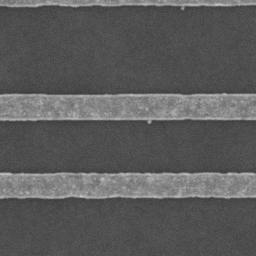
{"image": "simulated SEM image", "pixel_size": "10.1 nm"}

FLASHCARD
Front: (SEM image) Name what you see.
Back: lines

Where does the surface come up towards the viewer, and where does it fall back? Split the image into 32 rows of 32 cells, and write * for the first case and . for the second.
********************************
................................
................................
................................
................................
................................
................................
................................
................................
................................
................................
................................
********************************
********************************
********************************
................................
................................
................................
................................
................................
................................
................................
********************************
********************************
********************************
................................
................................
................................
................................
................................
................................
................................